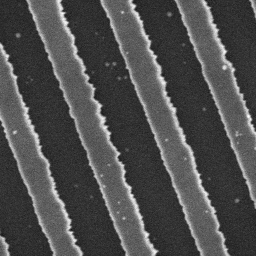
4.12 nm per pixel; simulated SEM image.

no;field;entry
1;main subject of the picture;lines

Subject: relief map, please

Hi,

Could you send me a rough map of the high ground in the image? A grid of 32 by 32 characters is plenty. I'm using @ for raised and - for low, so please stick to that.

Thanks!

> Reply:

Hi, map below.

----@@@@-----@@@@-----@@@@-----@
----@@@@-----@@@@------@@@------
----@@@@------@@@@-----@@@@-----
-----@@@@-----@@@@-----@@@@-----
-----@@@@-----@@@@------@@@-----
------@@@------@@@@-----@@@@----
@-----@@@@-----@@@@-----@@@@----
@-----@@@@------@@@@-----@@@----
@@-----@@@@-----@@@@-----@@@@---
@@-----@@@@-----@@@@-----@@@@---
@@-----@@@@------@@@@-----@@@@--
@@------@@@@-----@@@@-----@@@@--
@@@-----@@@@-----@@@@------@@@--
@@@------@@@@-----@@@@-----@@@@-
@@@@-----@@@@-----@@@@------@@@-
@@@@-----@@@@------@@@------@@@@
-@@@------@@@@-----@@@@-----@@@@
-@@@@-----@@@@-----@@@@------@@@
-@@@@------@@@------@@@@-----@@@
--@@@@-----@@@@-----@@@@-----@@@
--@@@@-----@@@@------@@@------@@
--@@@@------@@@@-----@@@@-----@@
---@@@@-----@@@@-----@@@@------@
---@@@@------@@@------@@@------@
----@@@------@@@@-----@@@@-----@
----@@@@-----@@@@------@@@------
----@@@@------@@@------@@@@-----
-----@@@@-----@@@@-----@@@@-----
-----@@@@-----@@@@------@@@-----
------@@@------@@@@-----@@@@----
@-----@@@@-----@@@@-----@@@@----
@------@@@------@@@------@@@----